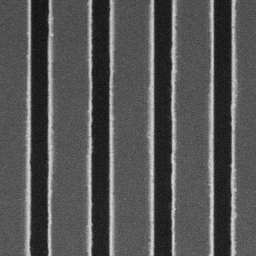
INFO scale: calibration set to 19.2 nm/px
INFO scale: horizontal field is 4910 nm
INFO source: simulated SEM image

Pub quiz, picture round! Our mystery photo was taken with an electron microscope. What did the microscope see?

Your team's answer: lines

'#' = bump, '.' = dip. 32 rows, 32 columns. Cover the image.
####..#####...#####...#####..###
####..#####...#####...#####..###
####..#####...#####...#####..###
####..#####...#####...#####..###
####..#####...#####...#####..###
####..#####...#####...#####..###
####..#####...#####...#####..###
####..#####...#####...#####..###
####..#####...#####...#####..###
####..#####...#####..######..###
####..#####...#####..######..###
####..#####...#####...#####..###
####..#####...#####..######..###
####..#####...#####..######..###
####..#####...#####..######..###
####..#####...#####...#####..###
####..#####...#####...#####..###
####..#####...#####...#####..###
####..#####...#####...#####..###
####..#####...#####..######..###
####..#####...#####..######..###
####..#####...#####...#####..###
####..#####...#####..######..###
####..#####...#####...#####..###
####..#####...#####...#####..###
####..#####...#####...#####..###
####..#####...#####...#####..###
####..#####...#####..######..###
####..#####...#####...#####..###
####..#####...#####...#####..###
####..#####...#####...#####..###
####..#####...#####...#####..###